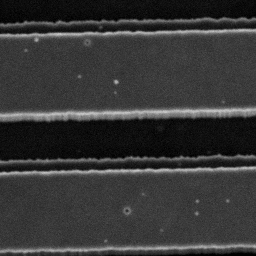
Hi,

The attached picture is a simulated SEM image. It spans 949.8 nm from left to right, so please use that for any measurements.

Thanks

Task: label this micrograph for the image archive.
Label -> lines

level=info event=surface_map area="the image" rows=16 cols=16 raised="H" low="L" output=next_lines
LLLLLLLLLLLLLLLL
LLLLLLLLLLLLLLLL
HHHHHHHHHHHHHHHH
HHHHHHHHHHHHHHHH
HHHHHHHHHHHHHHHH
HHHHHHHHHHHHHHHH
HHHHHHHHHHHHHHHH
LLLLLLLLLLLLLLLL
LLLLLLLLLLLLLLLL
LLLLLLLLLLLLLLLL
LLLLLLLLLLLLLLHH
HHHHHHHHHHHHHHHH
HHHHHHHHHHHHHHHH
HHHHHHHHHHHHHHHH
HHHHHHHHHHHHHHHH
HHHHHHHHHHHHHHLL